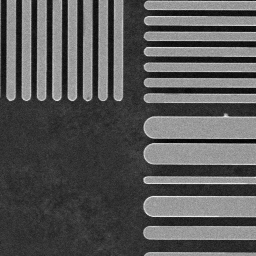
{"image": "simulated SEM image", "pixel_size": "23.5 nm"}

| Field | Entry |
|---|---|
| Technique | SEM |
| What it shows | groups of lines, slits or small figures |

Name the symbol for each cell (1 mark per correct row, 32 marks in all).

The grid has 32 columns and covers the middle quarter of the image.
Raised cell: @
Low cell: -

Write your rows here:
-@@--@@--@@-@@@-----@@@@@@@@@@@@
-@@--@@--@@-@@@-----@@@@@@@@@@@@
-@@--@@--@@-@@@-----------------
-@@--@@--@@-@@@-----------------
-@@--@@--@@-@@@-----@@@@@@@@@@@@
-@@--@@--@@-@@@------@@@@@@@@@@@
-@@--@@--@@-@@@-----------------
-@@--@@--@@-@@@-----------------
-@@--@@--@@-@@@-----@@@@@@@@@@@@
---------------------@@@@@@@@@@@
--------------------------------
--------------------------------
--------------------------------
---------------------@@@@@@@@@@@
--------------------@@@@@@@@@@@@
--------------------@@@@@@@@@@@@
--------------------@@@@@@@@@@@@
--------------------@@@@@@@@@@@@
--------------------------------
--------------------------------
---------------------@@@@@@@@@@@
--------------------@@@@@@@@@@@@
--------------------@@@@@@@@@@@@
--------------------@@@@@@@@@@@@
---------------------@@@@@@@@@@@
--------------------------------
--------------------------------
--------------------------------
--------------------@@@@@@@@@@@@
--------------------@@@@@@@@@@@@
--------------------------------
--------------------------------